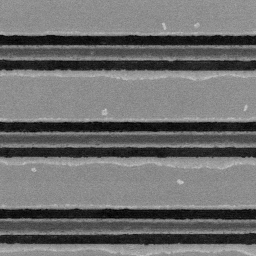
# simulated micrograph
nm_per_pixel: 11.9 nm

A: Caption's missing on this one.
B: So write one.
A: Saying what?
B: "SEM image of lines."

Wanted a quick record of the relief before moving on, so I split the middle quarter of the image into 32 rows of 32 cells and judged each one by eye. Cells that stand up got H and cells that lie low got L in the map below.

LLLLLLLLLLLLLLLLLLLLLLLLLLLLLLLL
LLLLLLLLLLLLLLLLLLLLLLLLLLLLLLLL
HHHHHHHHHHHHHHLLLLLLLLLHHHHHHHHH
HHHHHHHHHHHHHHHHHHHHHHHHHHHHHHHH
HHHHHHHHHHHHHHHHHHHHHHHHHHHHHHHH
HHHHHHHHHHHHHHHHHHHHHHHHHHHHHHHH
HHHHHHHHHHHHHHHHHHHHHHHHHHHHHHHH
HHHHHHHHHHHHHHHHHHHHHHHHHHHHHHHH
HHHHHHHHHHHHHHHHHHHHHHHHHHHHHHHH
HHHHHHHHHHHHHHHHHHHHHHHHHHHHHHHH
HHHHHHHHHHHHHHHHHHHHHHHHHHHHHHHH
HHHHHHHHHHHHHHHHHHHHHHHHHHHHHHHH
HHHHHHHHHHHHHHHHHHHHHHHHHHHHHHHH
HHHHHHHHHHHHHHHHHHHHHHHHHHHHHHHH
LLLLLLLLLLLLLLLLLLLLLLLLLLLLLLLL
LLLLLLLLLLLLLLLLLLLLLLLLLLLLLLLL
LLLLLLLLLLLLLLLLLLLLLLLLLLLLLLLL
HHHHHHHHHHHHHHHHHHHHHHHHHHHHHHHH
HHHHHHHHHHHHHHHHHHHHHHHHHHHHHHHH
HHHHHHHHHHHHHHHHHHHHHHHHHHHHHHHH
HHHHHHHHHHHHHHHHHHHHHHHHHHHHHHHH
LLLLLLLLLLLLLLLLLLLLLLLLLLLLLLLL
LLLLLLLLLLLLLLLLLLLLLLLLLLLLLLLL
LLLLLLLLLLLLLLLLLLLLLLLLLLLLLLLL
HHHHHHHHHHHHHHHLLHHHHHHHHHHLLLLL
HHHHHHHHHHHHHHHHHHHHHHHHHHHHHHHH
HHHHHHHHHHHHHHHHHHHHHHHHHHHHHHHH
HHHHHHHHHHHHHHHHHHHHHHHHHHHHHHHH
HHHHHHHHHHHHHHHHHHHHHHHHHHHHHHHH
HHHHHHHHHHHHHHHHHHHHHHHHHHHHHHHH
HHHHHHHHHHHHHHHHHHHHHHHHHHHHHHHH
HHHHHHHHHHHHHHHHHHHHHHHHHHHHHHHH